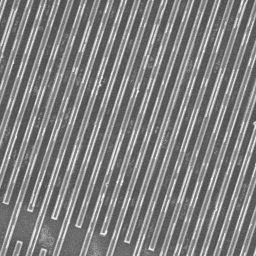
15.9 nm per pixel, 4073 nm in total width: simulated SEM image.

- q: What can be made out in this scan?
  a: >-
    parallel lines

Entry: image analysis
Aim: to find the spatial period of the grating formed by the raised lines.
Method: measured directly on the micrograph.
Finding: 0.203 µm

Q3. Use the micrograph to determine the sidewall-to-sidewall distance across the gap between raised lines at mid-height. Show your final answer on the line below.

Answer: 0.116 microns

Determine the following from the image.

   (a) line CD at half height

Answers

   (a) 0.0852 micrometres